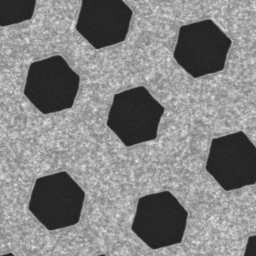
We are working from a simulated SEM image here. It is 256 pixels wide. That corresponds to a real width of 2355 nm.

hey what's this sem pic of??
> holes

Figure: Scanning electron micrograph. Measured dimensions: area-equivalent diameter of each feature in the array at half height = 514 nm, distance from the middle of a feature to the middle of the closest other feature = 875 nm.